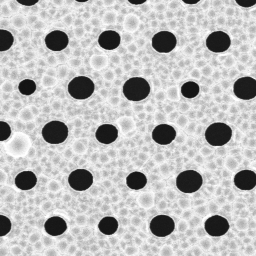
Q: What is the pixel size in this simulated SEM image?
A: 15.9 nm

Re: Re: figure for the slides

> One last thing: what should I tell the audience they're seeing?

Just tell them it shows a regular array of holes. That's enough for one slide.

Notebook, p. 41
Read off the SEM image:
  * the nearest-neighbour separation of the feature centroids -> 837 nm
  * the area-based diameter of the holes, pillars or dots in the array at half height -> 23.2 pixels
